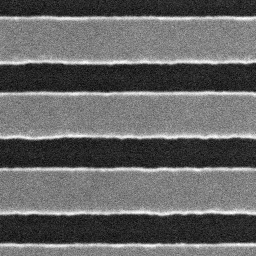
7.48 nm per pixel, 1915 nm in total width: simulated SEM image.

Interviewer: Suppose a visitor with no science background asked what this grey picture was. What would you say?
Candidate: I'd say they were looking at lines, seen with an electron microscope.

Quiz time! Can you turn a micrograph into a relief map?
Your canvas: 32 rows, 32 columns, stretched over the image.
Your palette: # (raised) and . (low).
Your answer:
................................
................................
################################
################################
################################
################################
################################
################################
................................
................................
................................
................................
################################
################################
################################
################################
################################
................................
................................
................................
................................
################################
################################
################################
################################
################################
################################
................................
................................
................................
.............................#.#
################################